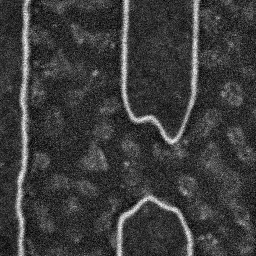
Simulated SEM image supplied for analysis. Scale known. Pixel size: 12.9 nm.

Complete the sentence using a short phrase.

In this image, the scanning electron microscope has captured one or a few lines or trenches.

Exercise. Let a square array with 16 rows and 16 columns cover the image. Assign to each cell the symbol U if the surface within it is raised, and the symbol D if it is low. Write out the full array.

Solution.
UUDDDDDDUUUUDDDD
UUDDDDDDUUUUDDDD
UUDDDDDDUUUUDDDD
UUDDDDDDUUUUDDDD
UUDDDDDDUUUUDDDD
UUDDDDDDUUUUDDDD
UDDDDDDDUUUUDDDD
UUDDDDDDDDUUDDDD
UUDDDDDDDDUDDDDD
UUDDDDDDDDDDDDDD
UDDDDDDDDDDDDDDD
UDDDDDDDDDDDDDDD
UDDDDDDDDUDDDDDD
UDDDDDDDUUUDDDDD
UDDDDDDUUUUUDDDD
UDDDDDDUUUUUDDDD